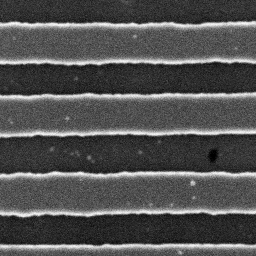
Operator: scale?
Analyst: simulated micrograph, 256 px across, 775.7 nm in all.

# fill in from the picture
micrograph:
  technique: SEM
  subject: lines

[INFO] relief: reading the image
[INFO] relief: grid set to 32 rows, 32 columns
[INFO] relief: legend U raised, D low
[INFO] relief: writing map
DDDDDDDDDDDDDDDDDDDDDDDDDDDDDDDD
DDDDDDDDDDDDDDDDDDDDDDDDDDDDDDDD
DDDDDDDDDDDDDDDDDDDDDDDDDDDDDDDD
UUUUUUUUUUUUUUUUUUUUUUUUUUUUUUUU
UUUUUUUUUUUUUUUUUUUUUUUUUUUUUUUU
UUUUUUUUUUUUUUUUUUUUUUUUUUUUUUUU
UUUUUUUUUUUUUUUUUUUUUUUUUUUUUUUU
UUUUUUUUUUUUUUUUUUUUUUUUUUUUUUUU
DDDDDDDDDDDDDDDDDDDDDDDDDDDDDDDD
DDDDDDDDDDDDDDDDDDDDDDDDDDDDDDDD
DDDDDDDDDDDDDDDDDDDDDDDDDDDDDDDD
DDDDDDDDDDDDDDDDDDDDDDDDDDDDDDDD
UUUUUUUUUUUUUUUUUUUUUUUUUUUUUUUU
UUUUUUUUUUUUUUUUUUUUUUUUUUUUUUUU
UUUUUUUUUUUUUUUUUUUUUUUUUUUUUUUU
UUUUUUUUUUUUUUUUUUUUUUUUUUUUUUUU
UUUUUUUUUUUUUUUUUUUUUUUUUUUUUUUU
DDDDDDDDDDDDDDDDDDDDDDDDDDDDDDDD
DDDDDDDDDDDDDDDDDDDDDDDDDDDDDDDD
DDDDDDDDDDDDDDDDDDDDDDDDDDDDDDDD
DDDDDDDDDDDDDDDDDDDDDDDDDDDDDDDD
DDDDDDDDDDDDDDDDDDDDDDDDDDDDDDDD
UUUUUUUUUUUUUUUUUUUUUUUUUUUUUUUU
UUUUUUUUUUUUUUUUUUUUUUUUUUUUUUUU
UUUUUUUUUUUUUUUUUUUUUUUUUUUUUUUU
UUUUUUUUUUUUUUUUUUUUUUUUUUUUUUUU
UUUUUUUUUUUUUUUUUUUUUUUUUUUUUUUU
DDDDDDDDDDDDDDDDDDDDDDDDDDDDDDDD
DDDDDDDDDDDDDDDDDDDDDDDDDDDDDDDD
DDDDDDDDDDDDDDDDDDDDDDDDDDDDDDDD
DDDDDDDDDDDDDDDDDDDDDDDDDDDDDDDD
UUUUUUUUUUUUUUUUUUUUUUUUUUUUUUUU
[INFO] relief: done